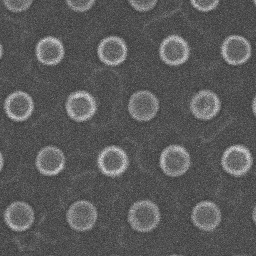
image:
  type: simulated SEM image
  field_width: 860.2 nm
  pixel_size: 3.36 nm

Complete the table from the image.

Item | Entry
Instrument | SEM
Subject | a regular array of raised bodies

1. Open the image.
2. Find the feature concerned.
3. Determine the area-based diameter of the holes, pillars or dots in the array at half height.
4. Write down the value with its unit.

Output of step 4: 97.1 nanometres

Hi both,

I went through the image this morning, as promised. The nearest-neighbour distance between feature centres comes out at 208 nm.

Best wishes